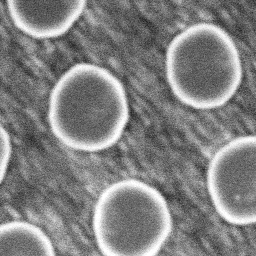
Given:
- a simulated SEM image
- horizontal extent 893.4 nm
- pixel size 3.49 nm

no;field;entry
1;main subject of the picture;raised bodies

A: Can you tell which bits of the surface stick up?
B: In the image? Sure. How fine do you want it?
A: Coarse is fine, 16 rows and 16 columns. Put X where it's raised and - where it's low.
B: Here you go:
-XXXX-----------
-XXX------------
-----------XXX--
----------XXXXX-
----XXX---XXXXX-
---XXXXX---XXXX-
---XXXXX----XX--
---XXXXX--------
----XXX---------
X-------------XX
-------------XXX
-------XX----XXX
------XXXX---XXX
------XXXXX---XX
XXX---XXXX------
XXX---XXXX------